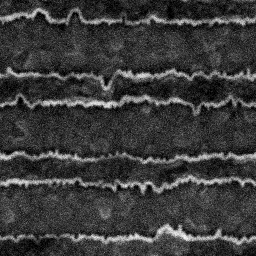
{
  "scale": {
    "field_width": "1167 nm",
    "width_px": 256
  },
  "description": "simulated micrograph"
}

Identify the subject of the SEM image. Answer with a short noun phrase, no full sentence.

one or a few lines or trenches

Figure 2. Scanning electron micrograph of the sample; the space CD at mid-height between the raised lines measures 51.7 pixels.